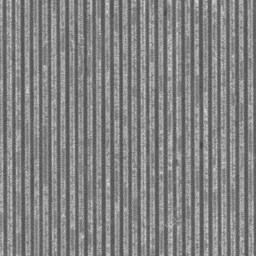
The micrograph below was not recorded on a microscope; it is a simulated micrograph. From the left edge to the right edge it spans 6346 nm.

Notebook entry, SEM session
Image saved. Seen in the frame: parallel lines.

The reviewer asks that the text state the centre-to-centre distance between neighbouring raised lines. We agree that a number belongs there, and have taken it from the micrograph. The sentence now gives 0.221 micrometres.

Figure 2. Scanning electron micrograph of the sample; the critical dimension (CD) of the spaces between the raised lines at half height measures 121 nm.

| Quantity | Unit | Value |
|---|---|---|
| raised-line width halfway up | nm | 96.1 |